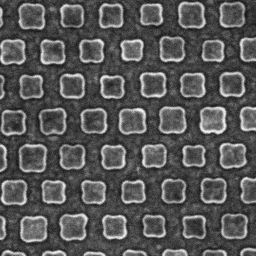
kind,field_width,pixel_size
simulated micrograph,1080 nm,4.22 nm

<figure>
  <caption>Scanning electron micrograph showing a regular array of raised bodies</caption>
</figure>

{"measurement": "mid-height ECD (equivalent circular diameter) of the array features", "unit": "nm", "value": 109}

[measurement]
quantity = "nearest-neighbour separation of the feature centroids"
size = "166 nm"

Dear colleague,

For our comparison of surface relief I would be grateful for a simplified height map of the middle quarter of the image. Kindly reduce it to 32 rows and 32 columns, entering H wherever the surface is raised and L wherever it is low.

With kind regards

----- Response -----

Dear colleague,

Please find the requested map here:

LLLLLLLLLLLLLLLLLLLLLLLLLLLLLLLL
LLLLLLLLLLLLLLLLLLLLLLLLLLLLLLLL
LLLLLLLLLLLLLLLLLLLLHHHHHLLLLLLL
HHHHHLLLLLHHHHHLLLLHHHHHHLLLLHHH
HHHHHLLLLHHHHHHLLLLHHHHHHLLLLHHH
HHHHHLLLLLHHHHHLLLLHHHHHHLLLLHHH
HHHHHLLLLHHHHHHLLLLLHHHHHLLLLHHH
HHHHHLLLLHHHHHHLLLLLHHHHHLLLLHHH
LLLLLLLLLLLLLLLLLLLLLLLLLLLLLLLL
LLLLLLLLLLLLLLLLLLLLLLLLLLLLLLLL
LLLLLLLLLLLLLLLLLLLLLLLLLLLLLLLL
LLLLLHHHHHLLLLHHHHHHLLLLHHHHHHLL
LLLLHHHHHHHLLLHHHHHHLLLLHHHHHHLL
LLLLHHHHHHLLLLHHHHHHLLLLHHHHHHLL
LLLLHHHHHHLLLLHHHHHHLLLLHHHHHHLL
LLLLLHHHHHLLLLHHHHHHLLLLHHHHHHLL
LLLLLHHHHHLLLLHHHHHHLLLLHHHHHHLL
LLLLLLLLLLLLLLLHLLLLLLLLLLLLLLLL
LLLLLLLLLLLLLLLLLLLLLLLLLLLLLLLL
LLLLLLLLLLLLLLLLLLLLLLLLLLLLLLLL
HHLHHLLLLLHHHHLLLLLLHHHHHLLLLLLH
HHHHHLLLLLHHHHHLLLLHHHHHHHLLLLHH
HHHHHLLLLLHHHHHLLLLLHHHHHLLLLLHH
HHHHHLLLLLHHHHHLLLLLHHHHHLLLLLHH
HHHHHLLLLLHHHHHLLLLLHHHHHLLLLLHH
HHHHHLLLLLHHHHHLLLLLHHHHHLLLLLLL
LLLLLLLLLLLLLLLLLLLLLLLLLLLLLLLL
LLLLLLLLLLLLLLLLLLLLLLLLLLLLLLLL
LLLLLLLLLLLLLLLLLLLLLLLLLLLLLLLL
LLLLLHHLLLLLLLLHHHHHLLLLLHHHHHLL
LLLLHHHHHHLLLLLHHHHHLLLLLHHHHHLL
LLLLLHHHHHLLLLLHHHHHLLLLLHHHHHLL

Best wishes